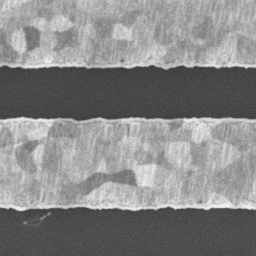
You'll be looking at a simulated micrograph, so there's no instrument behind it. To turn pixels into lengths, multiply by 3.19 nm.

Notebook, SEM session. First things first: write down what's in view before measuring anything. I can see lines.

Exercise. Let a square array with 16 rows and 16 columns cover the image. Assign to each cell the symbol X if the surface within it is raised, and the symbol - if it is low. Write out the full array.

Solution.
XXXXXXXXXXXXXXXX
XXXXXXXXXXXXXXXX
XXXXXXXXXXXXXXXX
XXXXXXXXXXXXXXXX
----------------
----------------
----------------
XXXXXXXXXXXXXXXX
XXXXXXXXXXXXXXXX
XXXXXXXXXXXXXXXX
XXXXXXXXXXXXXXXX
XXXXXXXXXXXXXXXX
XXXXXXXXXXXXXXXX
----------------
----------------
----------------